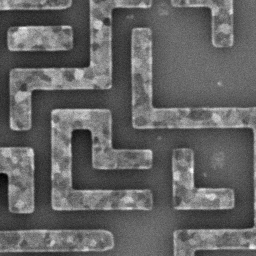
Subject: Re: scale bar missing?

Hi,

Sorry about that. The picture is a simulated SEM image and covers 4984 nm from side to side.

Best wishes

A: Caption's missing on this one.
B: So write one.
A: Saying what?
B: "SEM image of wiring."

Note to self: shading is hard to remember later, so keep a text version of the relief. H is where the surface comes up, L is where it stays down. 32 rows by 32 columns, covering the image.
HHHHHHHHHLLHHHHHHHHLLLHHHHHHHLLL
LLLLLLLLLLLHHHLLLLLLLLLLLLHHHLLL
LLLLLLLLLLLHHHLLLLLLLLLLLLLHHLLL
LHHHHHHHHLLHHHLLLLLLLLLLLLLHHLLL
LHHHHHHHHLLHHHLLHHHLLLLLLLLHHLLL
LHHHHHHHHLLHHHLLHHHLLLLLLLLHHLLL
LLLLLLLLLLLHHHLLHHHLLLLLLLLLLLLL
LLLLLLLLLLLHHHLLHHHLLLLLLLLLLLLL
LLLLLLLLLLLHHHLLHHHLLLLLLLLLLLLL
LHHHHHHHHHHHHHLLHHHLLLLLLLLLLLLL
LHHHHHHHHHHHHHLLLHHLLLLLLLLLLLLL
LHHHLLLLLLLLLLLLLHHLLLLLLLLLLLLL
LHHHLLLLLLLLLLLLLHHLLLLLLLLLLLLL
LHHHLLLLLLLLLLLLLHHLLLLLLLLLLLLL
LHHHLLHHHHHHHHLLLHHHHHHHHHHHHHHH
LHHHLLHHHHHHHHLLLHHHHHHHHHHHHHHH
LLLLLLHHHLLHHHLLLLLLLLLLLLLLLLLL
LLLLLLHHHLLLHHLLLLLLLLLLLLLLLLLL
LLLLLLLHHLLLHHLLLLLLLLLLLLLLLLLL
HHHHLLLHHLLLHHHHHHHLLLHHLLLLLLLL
HHHHLLLHHLLLHHHHHHHLLLHHLLLLLLLL
HHHHLLLHHLLLLLLLLLLLLLHHLLLLLLLL
LHHHLLLHHLLLLLLLLLLLLLHHLLLLLLLL
LHHHLLLHHLLLLLLLLLLLLLHHHLLLLLLL
LHHHLLLHHHHHHHHHHHHLLLHHHHHHHLLL
LHHHLLLHHHHHHHHHHHHLLLHHHHHHHLLL
LLHHLLLLLLLLLLLLLLLLLLLLLLLLLLLL
LLLLLLLLLLLLLLLLLLLLLLLLLLLLLLLL
LLLLLLLLLLLLLLLLLLLLLLLLLLLLLLLH
HHHHHHHHHHHHHHLLLLLLLLHHHHHHHHHH
HHHHHHHHHHHHHHLLLLLLLLHHHHHHHHHH
LLLLLLLLLLLLLLLLLLLLLLHHLLLLLLLL